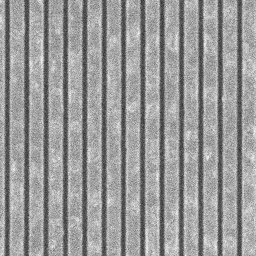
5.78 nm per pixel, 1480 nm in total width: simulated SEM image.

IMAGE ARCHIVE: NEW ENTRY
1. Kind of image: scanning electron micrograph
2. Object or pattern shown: parallel lines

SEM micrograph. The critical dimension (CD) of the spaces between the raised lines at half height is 28.9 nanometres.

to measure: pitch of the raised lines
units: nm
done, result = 112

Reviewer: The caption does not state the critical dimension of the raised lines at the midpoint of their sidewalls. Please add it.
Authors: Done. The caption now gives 80.9 nm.